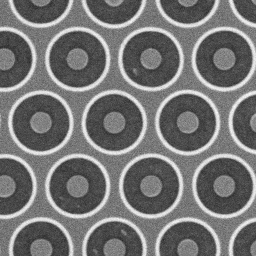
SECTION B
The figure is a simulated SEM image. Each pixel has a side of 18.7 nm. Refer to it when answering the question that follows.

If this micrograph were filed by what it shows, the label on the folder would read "an array of small figures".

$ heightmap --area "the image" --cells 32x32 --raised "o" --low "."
oo.......oo.......oo.......oo...
oo......ooo......ooo......ooo...
ooo....ooooo.....oooo.....oooo..
oooooooooooooooooooooooooooooooo
...oooo.....oooo.....ooooo....oo
....oo.......ooo......ooo......o
....oo.......oo........o........
....oo.......oo........o........
....oo.......oo........o........
...oooo......ooo......ooo......o
...ooooo....ooooo....ooooo....oo
ooooooooooooooooooooooo.oooooooo
ooo.....oooo.....oooo.....oooo..
oo......ooo.......oo.......oo...
o........oo.......oo.......oo...
o........o........oo.......oo...
oo.......oo.......oo.......oo...
oo......ooo......ooo.......ooo..
ooo....ooooo....ooooo....oooooo.
ooooooooo.oooooooo..oooooooooooo
...oooo.....oooo......ooo......o
....oo.......ooo......ooo......o
....oo.......oo........o........
....oo........o........o........
....oo.......oo.......ooo.......
....ooo......ooo......ooo......o
...ooooo....ooooo....ooooo....oo
oooooooooooooo.oooooooo.oooooooo
ooo.....oooo.....oooo.....oooo..
oo......ooo.......oo.......oo...
oo.......oo.......oo.......oo...
o........oo.......oo.......oo...